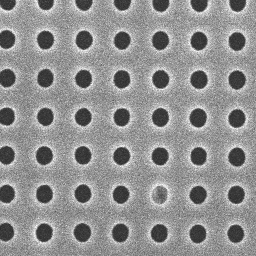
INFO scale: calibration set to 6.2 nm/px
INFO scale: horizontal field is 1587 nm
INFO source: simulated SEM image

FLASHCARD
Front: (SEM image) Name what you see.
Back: a regular array of holes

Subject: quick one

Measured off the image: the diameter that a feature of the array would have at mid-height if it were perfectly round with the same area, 113 nm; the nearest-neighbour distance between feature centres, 236 nanometres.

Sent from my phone